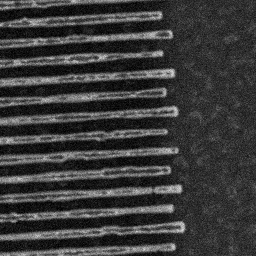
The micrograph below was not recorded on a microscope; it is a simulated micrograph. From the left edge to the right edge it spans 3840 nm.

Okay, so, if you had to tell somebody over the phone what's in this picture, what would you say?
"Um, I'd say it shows parallel lines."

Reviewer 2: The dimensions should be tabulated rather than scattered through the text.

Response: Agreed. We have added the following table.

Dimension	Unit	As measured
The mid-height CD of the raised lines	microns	0.0917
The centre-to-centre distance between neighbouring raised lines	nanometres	290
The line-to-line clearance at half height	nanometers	196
